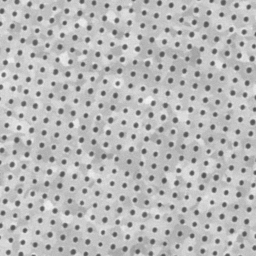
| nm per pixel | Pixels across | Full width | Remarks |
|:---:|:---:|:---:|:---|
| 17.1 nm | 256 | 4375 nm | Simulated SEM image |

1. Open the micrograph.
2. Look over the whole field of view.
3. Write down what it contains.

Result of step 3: a regular array of holes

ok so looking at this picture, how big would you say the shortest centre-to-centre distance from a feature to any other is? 0.208 µm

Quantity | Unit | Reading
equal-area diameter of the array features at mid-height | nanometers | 96.4